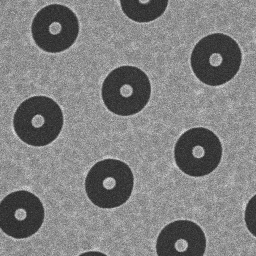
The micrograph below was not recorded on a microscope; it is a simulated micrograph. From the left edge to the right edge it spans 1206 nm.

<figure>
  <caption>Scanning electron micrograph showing ring-shaped grooves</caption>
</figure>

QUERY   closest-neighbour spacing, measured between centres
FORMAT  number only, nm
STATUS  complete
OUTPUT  443